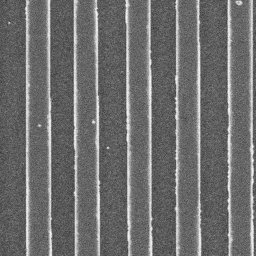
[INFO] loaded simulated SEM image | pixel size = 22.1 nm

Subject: lines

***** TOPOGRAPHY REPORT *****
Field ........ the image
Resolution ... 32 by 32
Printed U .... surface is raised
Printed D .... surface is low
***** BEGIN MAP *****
DDDUUUDDDUUUDDDDUUUDDDUUUDDDDUUD
DDDUUUDDDUUUDDDDUUUDDDUUUDDDDUUD
DDDUUUDDDUUUDDDDUUUDDDUUUDDDDUUD
DDDUUUDDDUUUDDDDUUUDDDUUUDDDDUUD
DDDUUUDDDUUUDDDDUUUDDDUUUDDDDUUD
DDDUUUDDDUUUDDDDUUUDDDUUUDDDDUUD
DDDUUUDDDUUUDDDDUUUDDDUUUDDDDUUD
DDDUUUDDDUUUDDDDUUUDDDUUUDDDDUUD
DDDUUUDDDUUUDDDDUUUDDDUUUDDDDUUD
DDDUUUDDDUUUDDDDUUUDDDUUUDDDDUUD
DDDUUUDDDUUUDDDDUUUDDDUUUDDDDUUD
DDDUUUDDDUUUDDDDUUUDDDUUUDDDDUUD
DDDUUUDDDUUUDDDDUUUDDDUUUDDDDUUD
DDDUUUDDDUUUDDDDUUUDDDUUUDDDDUUD
DDDUUUDDDUUUDDDDUUUDDDUUUDDDDUUD
DDDUUUDDDUUUDDDDUUUDDDUUUDDDDUUD
DDDUUUDDDUUUDDDDUUUDDDUUUDDDDUUD
DDDUUUDDDUUUDDDDUUUDDDUUUDDDDUUD
DDDUUUDDDUUUDDDDUUUDDDUUUDDDDUUD
DDDUUUDDDUUUDDDDUUUDDDUUUDDDDUUD
DDDUUUDDDUUUDDDDUUUDDDUUUDDDDUUD
DDDUUUDDDUUUDDDDUUUDDDUUUDDDDUUU
DDDUUUDDDUUUDDDDUUUDDDUUUDDDDUUU
DDDUUUDDDUUUDDDDUUUDDDUUUDDDDUUD
DDDUUUDDDUUUDDDDUUUDDDUUUDDDDUUD
DDDUUUDDDUUUDDDDUUUDDDUUUDDDDUUD
DDDUUUDDDUUUDDDDUUUDDDUUUDDDDUUD
DDDUUUDDDUUUDDDDUUUDDDUUUDDDDUUD
DDDUUUDDDUUUDDDDUUUDDDUUUDDDDUUU
DDDUUUDDDUUUDDDDUUUDDDUUUDDDDUUU
DDDUUUDDDUUUDDDDUUUDDDUUUDDDDUUU
DDDUUUDDDUUUDDDDUUUDDDUUUDDDDUUU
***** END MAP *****